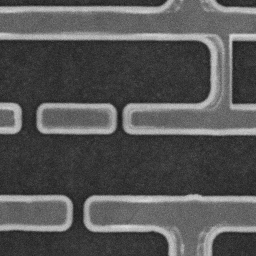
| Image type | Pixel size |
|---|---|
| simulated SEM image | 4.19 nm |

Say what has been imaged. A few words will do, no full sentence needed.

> one or a few lines or trenches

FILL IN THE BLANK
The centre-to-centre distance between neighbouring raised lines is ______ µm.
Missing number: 0.402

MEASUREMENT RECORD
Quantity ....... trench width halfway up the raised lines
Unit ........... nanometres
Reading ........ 278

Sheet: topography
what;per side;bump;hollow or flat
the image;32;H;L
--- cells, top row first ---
LLLLLLLLLLLLLLLLLLLLLHHHHHHLLLLL
HHHHHHHHHHHHHHHHHHHHHHHHHHHHHHHH
HHHHHHHHHHHHHHHHHHHHHHHHHHHHHHHH
HHHHHHHHHHHHHHHHHHHHHHHHHHHHHHHH
HHHHHHHHHHHHHHHHHHHHHHHHHHHHHHHH
LLLLLLLLLLLLLLLLLLLLLLLLLLHHHLLL
LLLLLLLLLLLLLLLLLLLLLLLLLLLHHLLL
LLLLLLLLLLLLLLLLLLLLLLLLLLLHHLLL
LLLLLLLLLLLLLLLLLLLLLLLLLLLHHLLL
LLLLLLLLLLLLLLLLLLLLLLLLLLLHHLLL
LLLLLLLLLLLLLLLLLLLLLLLLLLLHHLLL
LLLLLLLLLLLLLLLLLLLLLLLLLLLHHLLL
LLLLLLLLLLLLLLLLLLLLLLLLLLHHHLLL
HHLLLHHHHHHHHHLLHHHHHHHHHHHHHHHH
HHLLLHHHHHHHHHLLHHHHHHHHHHHHHHHH
HHLLLHHHHHHHHHLLHHHHHHHHHHHHHHHH
LLLLLLLLLLHHHHLLHHHHLLLHHHHHHHHH
LLLLLLLLLLLLLLLLLLLLLLLLLLLLLLLL
LLLLLLLLLLLLLLLLLLLLLLLLLLLLLLLL
LLLLLLLLLLLLLLLLLLLLLLLLLLLLLLLL
LLLLLLLLLLLLLLLLLLLLLLLLLLLLLLLL
LLLLLLLLLLLLLLLLLLLLLLLLLLLLLLLL
LLLLLLLLLLLLLLLLLLLLLLLLLLLLLLLL
LLLLLLLLLLLLLLLLLLLLLLLLLLLLLLLL
LLLLLLLLLLLLLLLLLLLLLLLLLLLLLLLL
HHHHHHHHHLLHHHHHHHHHHHHHHHHHHHHH
HHHHHHHHHLLHHHHHHHHHHHHHHHHHHHHH
HHHHHHHHHLLHHHHHHHHHHHHHHHHHHHHH
HLHHHHHHLLLHHHHHHHHHHHHHHHHHHHHH
LLLLLLLLLLLLLLLLLLLLLHHHHHHLLLLL
LLLLLLLLLLLLLLLLLLLLLHHHHHLLLLLL
LLLLLLLLLLLLLLLLLLLLLHHHHHLLLLLL